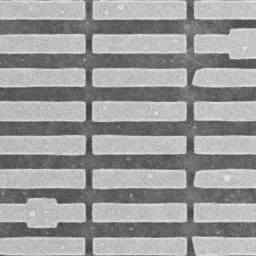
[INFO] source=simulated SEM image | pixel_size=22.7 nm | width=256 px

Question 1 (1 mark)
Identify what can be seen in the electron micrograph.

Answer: wiring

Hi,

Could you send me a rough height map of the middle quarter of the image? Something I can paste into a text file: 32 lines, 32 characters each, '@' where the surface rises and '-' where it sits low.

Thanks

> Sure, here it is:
--------------------------------
@@@@@--@@@@@@@@@@@@@@@@@@@@@@@--
@@@@@--@@@@@@@@@@@@@@@@@@@@@@@--
@@@@@--@@@@@@@@@@@@@@@@@@@@@@@--
@@@@@--@@@@@@@@@@@@@@@@@@@@@@@--
----@--@@@@@@@@@@@-----------@--
--------------------------------
--------------------------------
--------------------------------
--------------------------------
@@@@@--@@@@@@@@@@@@@@@@@@@@@@@--
@@@@@--@@@@@@@@@@@@@@@@@@@@@@@--
@@@@@--@@@@@@@@@@@@@@@@@@@@@@@--
@@@@@--@@@@@@@@@@@@@@@@@@@@@@@--
--------------------------------
--------------------------------
--------------------------------
--------------------------------
@@@@@--@@@@@@@@@@@@@@@@@@@@@@@--
@@@@@--@@@@@@@@@@@@@@@@@@@@@@@--
@@@@@--@@@@@@@@@@@@@@@@@@@@@@@--
@@@@@--@@@@@@@@@@@@@@@@@@@@@@@--
@@@@@---@-----------------------
--------------------------------
--------------------------------
--------------------------------
@@@@@--@@@@@@@@@@@@@@@@---------
@@@@@--@@@@@@@@@@@@@@@@@@@@@@@--
@@@@@--@@@@@@@@@@@@@@@@@@@@@@@--
@@@@@--@@@@@@@@@@@@@@@@@@@@@@@--
@@@@@--@@@@@@@@@@@@@@@@@@@@@@@--
--------------------------------